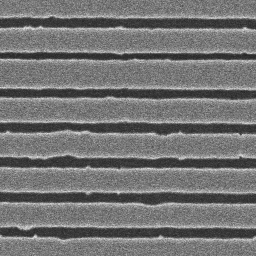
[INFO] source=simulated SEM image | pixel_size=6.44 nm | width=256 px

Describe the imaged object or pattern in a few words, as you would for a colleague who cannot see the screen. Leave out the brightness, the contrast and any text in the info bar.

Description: parallel lines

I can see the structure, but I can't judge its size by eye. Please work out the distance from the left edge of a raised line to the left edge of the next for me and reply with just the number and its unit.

225 nm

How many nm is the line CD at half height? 167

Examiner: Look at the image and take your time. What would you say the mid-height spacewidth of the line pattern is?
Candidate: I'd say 57.9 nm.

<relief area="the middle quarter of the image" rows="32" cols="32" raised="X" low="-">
XXXXXXXXXXXXXXXXXXXXXXXXXXXXXXXX
XXXXXXXXXXXXXXXXXXXXXXXXXXXXXXXX
XXXXXXXXXXXXXXXXXXXXXXXXXXXXXXXX
XXXXXXXXXXXXXXXXXXXXXXXXXXXXXXXX
XXXXXXXXXXXXXXXXXXXXXXXXXXXXXXXX
XXXXXXXXXXXXXXXXXXXXXXXXXXXXXXXX
-------------------------------X
--------------------------------
XXXXXXX---XXX-----------------X-
XXXXXXXXXXXXXXXXXXXXXXXXXXXXXXXX
XXXXXXXXXXXXXXXXXXXXXXXXXXXXXXXX
XXXXXXXXXXXXXXXXXXXXXXXXXXXXXXXX
XXXXXXXXXXXXXXXXXXXXXXXXXXXXXXXX
XXXXXXXXXXXXXXXXXXXXXXXXXXXXXXXX
XXXXXXXXXXXXXXXXXXXXXXXXXXXXXXXX
--------------------------------
--------------------------------
XXXXXXXXXXXXXXXXXXXXXXX---XXXXXX
XXXXXXXXXXXXXXXXXXXXXXXXXXXXXXXX
XXXXXXXXXXXXXXXXXXXXXXXXXXXXXXXX
XXXXXXXXXXXXXXXXXXXXXXXXXXXXXXXX
XXXXXXXXXXXXXXXXXXXXXXXXXXXXXXXX
XXXXXXXXXXXXXXXXXXXXXXXXXXXXXXXX
---XXXXXXXXXXXXX--XXXXXX----XXXX
--------------------------------
--------------------------------
XXXXXXXXXXXXXXXXXXXXXXXXXXXXXXXX
XXXXXXXXXXXXXXXXXXXXXXXXXXXXXXXX
XXXXXXXXXXXXXXXXXXXXXXXXXXXXXXXX
XXXXXXXXXXXXXXXXXXXXXXXXXXXXXXXX
XXXXXXXXXXXXXXXXXXXXXXXXXXXXXXXX
XXXXXXXXXXXXXXXXXXXXXXXXXXXXXXXX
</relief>